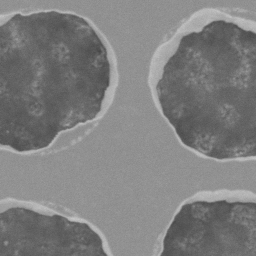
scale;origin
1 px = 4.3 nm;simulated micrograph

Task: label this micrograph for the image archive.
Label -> holes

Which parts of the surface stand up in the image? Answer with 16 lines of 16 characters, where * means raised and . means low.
****************
......*******..*
.......****.....
.......***......
.......***......
.......***......
......****......
......*****.....
....*******.....
*************...
****************
****************
**************..
....*******.....
......****......
......****......